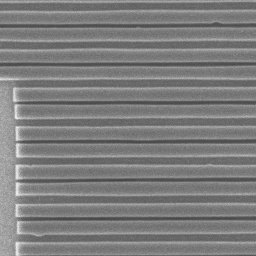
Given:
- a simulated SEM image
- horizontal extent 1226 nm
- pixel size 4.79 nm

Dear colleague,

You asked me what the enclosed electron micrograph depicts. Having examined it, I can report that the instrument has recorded parallel lines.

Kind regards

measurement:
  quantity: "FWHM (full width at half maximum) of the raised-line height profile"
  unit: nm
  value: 62.3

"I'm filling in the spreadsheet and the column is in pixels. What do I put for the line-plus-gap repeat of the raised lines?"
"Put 19.2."